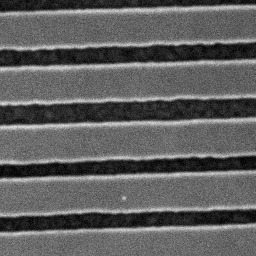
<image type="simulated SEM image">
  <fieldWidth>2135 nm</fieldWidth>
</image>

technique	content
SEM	lines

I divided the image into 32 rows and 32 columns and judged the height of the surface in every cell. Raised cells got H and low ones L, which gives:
LLLLLLLLLLLLLLLLLLLLLLLLLLLLLLLL
LLLLHHHHHHHHHHHHHHHHHHHHHHHHHHHH
HHHHHHHHHHHHHHHHHHHHHHHHHHHHHHHH
HHHHHHHHHHHHHHHHHHHHHHHHHHHHHHHH
HHHHHHHHHHHHHHHHHHHHHHHHHHHHHHHH
HHHHHHHHHHHHHHHHHHHHHHHHHHHLLLLL
LLLLLLLLLLLLLLLLLLLLLLLLLLLLLLLL
LLLLLLLLLLLLLLLLLLLLLLLLLLLLLLLH
HHHHHHHHHHHHHHHHHHHHHHHHHHHHHHHH
HHHHHHHHHHHHHHHHHHHHHHHHHHHHHHHH
HHHHHHHHHHHHHHHHHHHHHHHHHHHHHHHH
HHHHHHHHHHHHHHHHHHHHHHHHHHHHHHHH
HHHHHHHHHHHHHHHHHHHHHHLLLLLLLLLL
LLLLLLLLLLLLLLLLLLLLLLLLLLLLLLLL
LLLLLLLLLLLLLLLLLLLLLLLLLLLLLLLL
LLLLLLLLLHHHHHHHHHHHHHHHHHHHHHHH
HHHHHHHHHHHHHHHHHHHHHHHHHHHHHHHH
HHHHHHHHHHHHHHHHHHHHHHHHHHHHHHHH
HHHHHHHHHHHHHHHHHHHHHHHHHHHHHHHH
HHHHHHHHHHHHHHHHHHHHHHHHHHHHHHLL
LLLLLLLLLLLLLLLLLLLLLLLLLLLLLLLL
LLLLLLLLLLLLLLLLLLLLLLLLLLHHHHHH
HHHHHHHHHHHHHHHHHHHHHHHHHHHHHHHH
HHHHHHHHHHHHHHHHHHHHHHHHHHHHHHHH
HHHHHHHHHHHHHHHHHHHHHHHHHHHHHHHH
HHHHHHHHHHHHHHHHHHHHHHHHHHHHHHHH
HHHHHHHHHHHHHHHHHHLLLLLLLLLLLLLL
LLLLLLLLLLLLLLLLLLLLLLLLLLLLLLLL
LLLLLLLLLLLLLLLLLHHHHHHHHHHHHHHH
HHHHHHHHHHHHHHHHHHHHHHHHHHHHHHHH
HHHHHHHHHHHHHHHHHHHHHHHHHHHHHHHH
HHHHHHHHHHHHHHHHHHHHHHHHHHHHHHHH